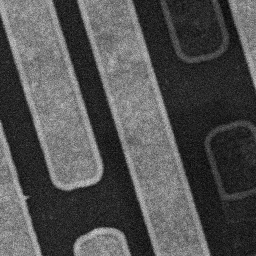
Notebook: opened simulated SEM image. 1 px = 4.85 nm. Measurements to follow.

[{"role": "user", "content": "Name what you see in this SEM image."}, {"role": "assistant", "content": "one or a few lines or trenches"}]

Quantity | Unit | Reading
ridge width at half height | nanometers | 226